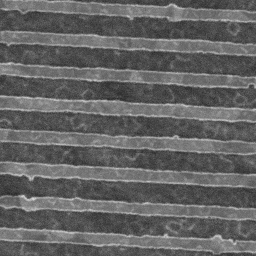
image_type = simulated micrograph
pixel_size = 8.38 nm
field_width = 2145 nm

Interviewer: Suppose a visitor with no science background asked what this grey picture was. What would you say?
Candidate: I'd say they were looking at parallel lines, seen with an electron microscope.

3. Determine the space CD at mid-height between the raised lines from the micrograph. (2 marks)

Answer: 178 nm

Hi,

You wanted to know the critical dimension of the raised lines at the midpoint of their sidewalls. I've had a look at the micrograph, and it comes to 96.3 nm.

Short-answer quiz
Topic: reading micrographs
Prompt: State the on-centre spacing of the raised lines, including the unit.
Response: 275 nm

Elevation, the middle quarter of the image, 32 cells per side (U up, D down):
DDDDDDDDDDDDDDDDDDDDDDDDDDDDDDDD
UUUUUUUUUUUDDDDDDDDDDDDDDDDDDDDD
UUUUUUUUUUUUUUUUUUUUUUUUUUUUUUDD
DDUUUUUUUUUUUUUUUUUUUUUUUUUUUUUU
DDDDDDDDDDDDDDDDDDUUUUUUUUUUUUUU
DDDDDDDDDDDDDDDDDDDDDDDDDDDDDDDD
DDDDDDDDDDDDDDDDDDDDDDDDDDDDDDDD
DDDDDDDDDDDDDDDDDDDDDDDDDDDDDDDD
DDDDDDDDDDDDDDDDDDDDDDDDDDDDDDDD
UUUUUUUUUUUUUUUDDDDDDDDDDDDDDDDD
UUUUUUUUUUUUUUUUUUUUUUUUUUUUUUDD
UUUUUUUUUUUUUUUUUUUUUUUUUUUUUUUU
DDDDDDDDDUUUUUUUUUUUUUUUUUUUUUUU
DDDDDDDDDDDDDDDDDDDDDDDDDDDDUDDD
DDDDDDDDDDDDDDDDDDDDDDDDDDDDDDDD
DDDDDDDDDDDDDDDDDDDDDDDDDDDDDDDD
DDDDDDDDDDDDDDDDDDDDDDDDDDDDDDDD
UUUUDDUUDDDDDDDDDDDDDDDDDDDDDDDD
UUUUUUUUUUUUUUUUUUUUUUDDUUUUUDDD
UUUUUUUUUUUUUUUUUUUUUUUUUUUUUUUU
DDDDDDDDDDDDUUUUUUUUUUUUUUUUUUUU
DDDDDDDDDDDDDDDDDDDDDDDDDDDDUUUU
DDDDDDDDDDDDDDDDDDDDDDDDDDDDDDDD
DDDDDDDDDDDDDDDDDDDDDDDDDDDDDDDD
DDDDDDDDDDDDDDDDDDDDDDDDDDDDDDDD
UUDDDDDDDDDDDDDDDDDDDDDDDDDDDDDD
UUUUUUUUUUUUUUUUUUUDDDDDDDDDDDDD
UUUUUUUUUUUUUUUUUUUUUUUUUUUUUUUU
DDDDUUUUUUUUUUUUUUUUUUUUUUUUUUUU
DDDDDDDDDDDDDDDDDDDDDDDDDUUUUUUU
DDDDDDDDDDDDDDDDDDDDDDDDDDDDDDDD
DDDDDDDDDDDDDDDDDDDDDDDDDDDDDDDD